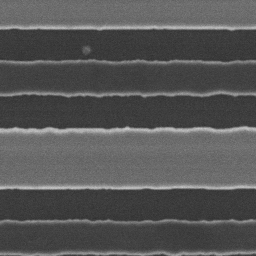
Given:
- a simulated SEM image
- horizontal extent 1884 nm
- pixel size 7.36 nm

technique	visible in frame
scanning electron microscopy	lines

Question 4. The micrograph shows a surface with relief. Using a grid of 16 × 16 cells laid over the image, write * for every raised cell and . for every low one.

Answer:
****************
****************
................
................
****************
****************
................
................
****************
****************
****************
****************
................
................
****************
****************